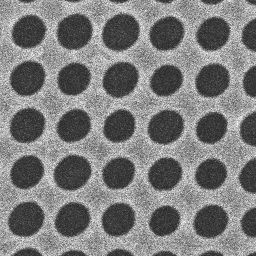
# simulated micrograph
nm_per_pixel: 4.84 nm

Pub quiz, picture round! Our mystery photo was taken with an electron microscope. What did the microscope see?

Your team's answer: a regular array of holes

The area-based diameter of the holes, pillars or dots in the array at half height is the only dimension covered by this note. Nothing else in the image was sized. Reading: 166 nanometres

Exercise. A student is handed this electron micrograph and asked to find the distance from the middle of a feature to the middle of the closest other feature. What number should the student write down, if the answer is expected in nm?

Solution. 222